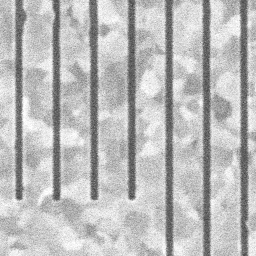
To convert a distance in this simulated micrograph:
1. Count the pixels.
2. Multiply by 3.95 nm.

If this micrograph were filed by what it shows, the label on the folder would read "parallel lines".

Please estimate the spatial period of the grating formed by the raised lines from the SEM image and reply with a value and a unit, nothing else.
148 nm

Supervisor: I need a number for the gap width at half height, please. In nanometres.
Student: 34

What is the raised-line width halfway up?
112 nm